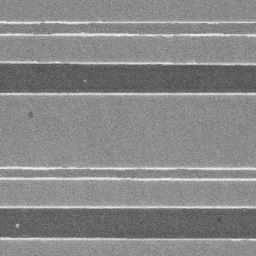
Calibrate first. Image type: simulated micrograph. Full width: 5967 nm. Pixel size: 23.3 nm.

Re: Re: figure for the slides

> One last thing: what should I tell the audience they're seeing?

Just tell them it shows lines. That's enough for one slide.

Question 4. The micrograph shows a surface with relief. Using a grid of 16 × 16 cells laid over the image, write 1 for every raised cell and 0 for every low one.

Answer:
1111111111111111
1111111111111111
1111111111111111
1111111111111111
0000000000000000
0000000000000000
1111111111111111
1111111111111111
1111111111111111
1111111111111111
1111111111111111
1111111111111111
1111111111111111
0000000000000000
0000000000000000
1111111111111111